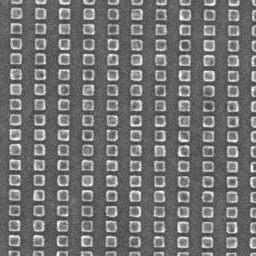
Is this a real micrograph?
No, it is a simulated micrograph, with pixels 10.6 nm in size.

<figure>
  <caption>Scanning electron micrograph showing a regular array of raised bodies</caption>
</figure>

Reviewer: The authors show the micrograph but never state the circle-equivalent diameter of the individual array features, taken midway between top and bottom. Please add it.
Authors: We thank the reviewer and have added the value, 11.2 pixels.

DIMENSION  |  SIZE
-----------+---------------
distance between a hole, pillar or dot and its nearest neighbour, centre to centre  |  159 nanometers